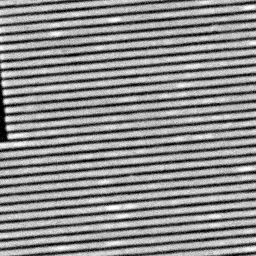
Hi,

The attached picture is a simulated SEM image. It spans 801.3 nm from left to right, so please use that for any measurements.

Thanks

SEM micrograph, parallel lines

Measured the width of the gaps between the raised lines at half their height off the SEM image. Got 10.9 nm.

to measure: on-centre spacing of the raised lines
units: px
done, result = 8.91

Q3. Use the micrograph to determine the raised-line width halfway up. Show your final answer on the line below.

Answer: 19.1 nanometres